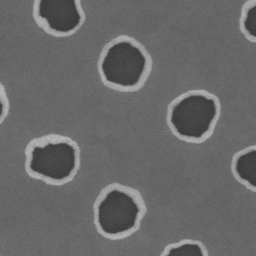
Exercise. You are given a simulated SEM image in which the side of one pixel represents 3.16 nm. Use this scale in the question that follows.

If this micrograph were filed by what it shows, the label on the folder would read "holes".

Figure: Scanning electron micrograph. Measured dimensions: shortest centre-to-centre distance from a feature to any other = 0.266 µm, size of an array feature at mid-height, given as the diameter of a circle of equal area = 0.133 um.